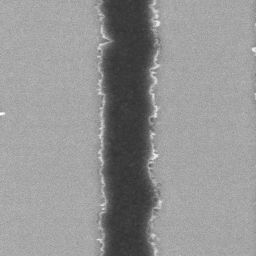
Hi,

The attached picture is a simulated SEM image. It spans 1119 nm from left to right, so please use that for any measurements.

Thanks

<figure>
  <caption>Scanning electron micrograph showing one or a few lines or trenches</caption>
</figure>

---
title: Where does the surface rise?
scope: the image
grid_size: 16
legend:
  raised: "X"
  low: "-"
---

------XXXX------
------XXXX------
------XXXX------
------XXXX------
------XXXX------
------XXXX------
------XXXX------
------XXXX------
------XXXX------
------XXXX------
------XXX-------
------XXXX------
------XXXX------
------XXXX------
------XXX-------
------XXXX------